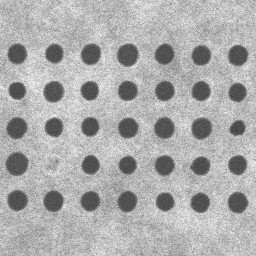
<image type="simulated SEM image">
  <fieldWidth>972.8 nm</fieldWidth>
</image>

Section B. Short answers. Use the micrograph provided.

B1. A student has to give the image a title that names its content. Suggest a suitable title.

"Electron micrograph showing a regular array of holes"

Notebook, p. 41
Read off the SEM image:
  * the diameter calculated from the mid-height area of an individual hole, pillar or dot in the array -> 70.2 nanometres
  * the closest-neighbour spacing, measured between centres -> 138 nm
